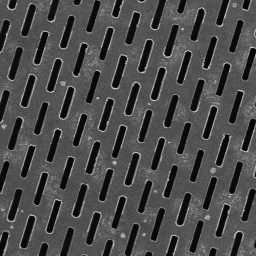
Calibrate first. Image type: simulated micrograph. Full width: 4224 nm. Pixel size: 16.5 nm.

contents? a regular array of holes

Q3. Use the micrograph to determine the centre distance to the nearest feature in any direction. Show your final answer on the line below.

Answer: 497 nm